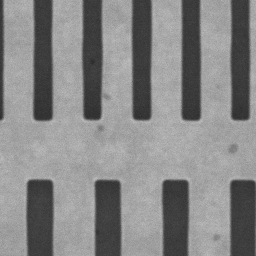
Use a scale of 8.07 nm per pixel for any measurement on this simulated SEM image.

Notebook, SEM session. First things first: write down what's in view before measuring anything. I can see groups of lines, slits or small figures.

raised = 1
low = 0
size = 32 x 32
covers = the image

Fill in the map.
01110001110001110001111001111001
01110001110001110001111001111001
01110001110001110001111001111001
01110001110001110001111001111001
01110001110001110001111001111001
01110001110001110001111001111001
01110001110001110001111001111001
01110001110001110001111001111001
01110001110001110001111001111001
01110001110001110001111001111001
01110001110001110001111001111001
01110001110001110001111001111001
01110001110001110001111001111001
01110001110001110001111001111001
01110001110001111001111001111001
11111111111111111111111111111111
11111111111111111111111111111111
11111111111111111111111111111111
11111111111111111111111111111111
11111111111111111111111111111111
11111111111111111111111111111111
11111111111111111111111111111111
11110011111100011111100111111000
11100001111100011111000011111000
11100001111100011111000011111000
11100001111100011111000011111000
11100001111100011111000011111000
11100001111100011111000011111000
11100001111100011111000011111000
11100001111100011111000011111000
11100001111100011111000011111000
11100001111100011111000011111000